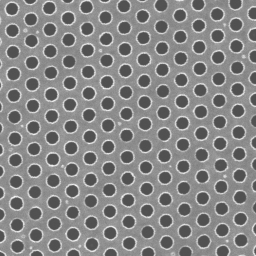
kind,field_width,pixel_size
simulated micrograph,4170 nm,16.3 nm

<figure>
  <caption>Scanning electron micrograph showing a regular array of holes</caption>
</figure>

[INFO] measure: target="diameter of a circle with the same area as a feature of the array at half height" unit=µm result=0.198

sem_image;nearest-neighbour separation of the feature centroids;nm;348